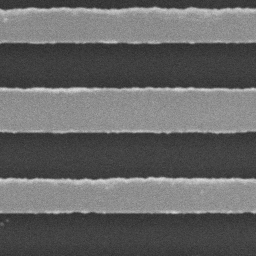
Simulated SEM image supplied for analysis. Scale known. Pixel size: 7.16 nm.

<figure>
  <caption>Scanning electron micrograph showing lines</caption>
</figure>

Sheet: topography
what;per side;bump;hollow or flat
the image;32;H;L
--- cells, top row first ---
LLLLLLLLLLLLLLLLLLLLLLLLLLLLLLLL
HHHHHHHHHHHHHHHHHHHHHHHHHHHHHHHH
HHHHHHHHHHHHHHHHHHHHHHHHHHHHHHHH
HHHHHHHHHHHHHHHHHHHHHHHHHHHHHHHH
HHHHHHHHHHHHHHHHHHHHHHHHHHHHHHHH
LLLLLLLLLLLLLLLLLLLLLLLLLLLLLLLL
LLLLLLLLLLLLLLLLLLLLLLLLLLLLLLLL
LLLLLLLLLLLLLLLLLLLLLLLLLLLLLLLL
LLLLLLLLLLLLLLLLLLLLLLLLLLLLLLLL
LLLLLLLLLLLLLLLLLLLLLLLLLLLLLLLL
LLLLLLLLLLLLLLLLLLLLLLLLLLLLLLLL
HHHHHHHHHHHHHHHHHHHHHHHHHHHHHHHH
HHHHHHHHHHHHHHHHHHHHHHHHHHHHHHHH
HHHHHHHHHHHHHHHHHHHHHHHHHHHHHHHH
HHHHHHHHHHHHHHHHHHHHHHHHHHHHHHHH
HHHHHHHHHHHHHHHHHHHHHHHHHHHHHHHH
LHLLLLHHHLLLLHLLLLLHHHLLLHHHHHLL
LLLLLLLLLLLLLLLLLLLLLLLLLLLLLLLL
LLLLLLLLLLLLLLLLLLLLLLLLLLLLLLLL
LLLLLLLLLLLLLLLLLLLLLLLLLLLLLLLL
LLLLLLLLLLLLLLLLLLLLLLLLLLLLLLLL
LLLLLLLLLLLLLLLLLLLLLLLLLLLLLLLL
HHHHHHHHLLHLLHHHHHHHHHHHHHHHHHHH
HHHHHHHHHHHHHHHHHHHHHHHHHHHHHHHH
HHHHHHHHHHHHHHHHHHHHHHHHHHHHHHHH
HHHHHHHHHHHHHHHHHHHHHHHHHHHHHHHH
HHHHHHHHHLHLHHHHHHHHHHHHHHHHHHHH
LLLLLLLLLLLLLLLLLLLLLLLLLLLLLLLL
LLLLLLLLLLLLLLLLLLLLLLLLLLLLLLLL
LLLLLLLLLLLLLLLLLLLLLLLLLLLLLLLL
LLLLLLLLLLLLLLLLLLLLLLLLLLLLLLLL
LLLLLLLLLLLLLLLLLLLLLLLLLLLLLLLL